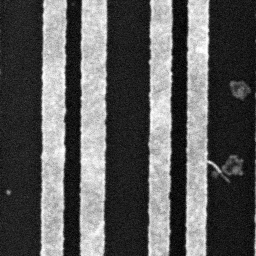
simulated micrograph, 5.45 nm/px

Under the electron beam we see lines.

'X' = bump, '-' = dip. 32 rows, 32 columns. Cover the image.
------XX--XXX------XX---XX------
-----XXX--XXX------XX---XX------
-----XXX--XXX------XX---XX------
-----XXX--XXX------XX---XX------
-----XXX--XXX------XX---XX------
-----XXX--XXX------XX---XX------
-----XXX--XXX------XX---XX------
-----XXX--XXX------XX---XX------
-----XXX--XXX------XX---XX------
-----XXX--XXX------XX---XX------
-----XXX--XXX------XX---XX------
-----XXX--XXX------XX---XX------
-----XXX--XXX------XX---XX------
-----XXX--XXX------XX---XX------
-----XXX--XXX------XX---XX------
-----XXX--XXX------XX---XX------
-----XXX--XXX------XX---XX------
-----XXX--XXX------XX--XXX------
-----XXX--XXX------XX--XXX------
-----XXX--XXX------XX--XXX------
-----XXX--XXX------XX--XXX------
-----XXX--XXX------XX--XXX------
-----XXX--XXX------XX--XXX------
-----XXX--XXX------XX--XXX------
-----XXX--XXX------XX--XXX------
-----XXX--XXX------XX--XXX------
-----XXX--XXX------XX--XXX------
-----XXX--XXX------XX--XXX------
-----XXX--XXX------XX--XXX------
-----XXX--XXX------XX--XXX------
-----XXX--XXX------XX--XXX------
-----XXX--XXX------XX--XXX------